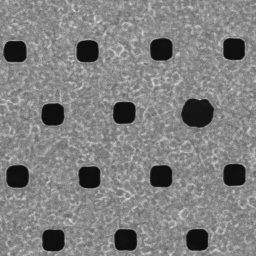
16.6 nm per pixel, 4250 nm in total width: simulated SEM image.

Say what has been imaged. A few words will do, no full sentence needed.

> a regular array of holes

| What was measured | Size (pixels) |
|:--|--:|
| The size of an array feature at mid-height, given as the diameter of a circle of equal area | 23.9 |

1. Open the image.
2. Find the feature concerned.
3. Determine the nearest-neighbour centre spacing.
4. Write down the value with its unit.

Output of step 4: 1190 nm